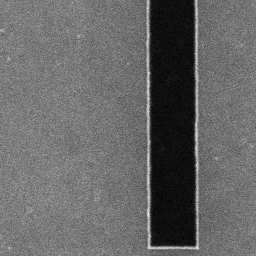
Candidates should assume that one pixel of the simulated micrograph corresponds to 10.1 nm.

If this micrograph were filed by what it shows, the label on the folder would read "one or a few lines or trenches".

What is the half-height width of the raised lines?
493 nm